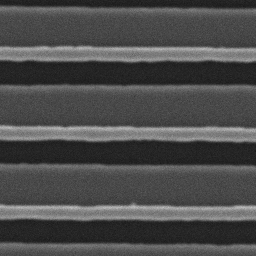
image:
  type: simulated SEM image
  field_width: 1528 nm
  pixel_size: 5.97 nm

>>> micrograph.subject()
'lines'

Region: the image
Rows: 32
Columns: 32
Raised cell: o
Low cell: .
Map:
................................
oooooooooooooooooooooooooooooooo
oooooooooooooooooooooooooooooooo
oooooooooooooooooooooooooooooooo
oooooooooooooooooooooooooooooooo
oooooooooooooooooooooooooooooooo
oooooooooooooooooooooooooooooooo
.oo.ooooooo.oooooooooooooo.ooooo
................................
................................
................................
oooooooooooooooooooooooooooooooo
oooooooooooooooooooooooooooooooo
oooooooooooooooooooooooooooooooo
oooooooooooooooooooooooooooooooo
oooooooooooooooooooooooooooooooo
oooooooooooooooooooooooooooooooo
...........ooo........oo..oooooo
................................
................................
................................
oooooooooooooooooooooooooooooooo
oooooooooooooooooooooooooooooooo
oooooooooooooooooooooooooooooooo
oooooooooooooooooooooooooooooooo
oooooooooooooooooooooooooooooooo
oooooooooooooooooooooooooooooooo
................................
................................
................................
................................
oooooooooooooooooooooooooooooooo